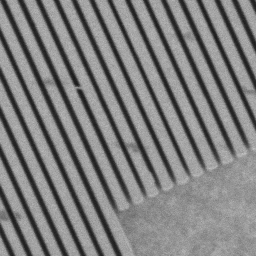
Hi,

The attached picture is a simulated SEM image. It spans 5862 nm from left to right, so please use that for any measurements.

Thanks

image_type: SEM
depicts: parallel lines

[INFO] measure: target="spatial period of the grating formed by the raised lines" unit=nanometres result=371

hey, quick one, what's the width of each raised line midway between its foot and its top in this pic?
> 258 nanometres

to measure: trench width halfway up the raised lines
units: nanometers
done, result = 99